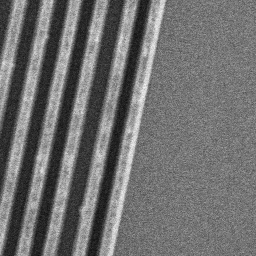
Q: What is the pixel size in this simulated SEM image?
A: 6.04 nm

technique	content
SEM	parallel lines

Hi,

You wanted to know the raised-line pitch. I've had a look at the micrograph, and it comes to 162 nm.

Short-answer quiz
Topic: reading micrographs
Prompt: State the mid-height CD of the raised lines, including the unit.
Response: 72.4 nm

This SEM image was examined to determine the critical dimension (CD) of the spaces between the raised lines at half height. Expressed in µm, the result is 0.0887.